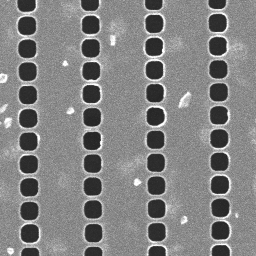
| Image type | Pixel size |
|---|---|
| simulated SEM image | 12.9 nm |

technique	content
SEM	a regular array of holes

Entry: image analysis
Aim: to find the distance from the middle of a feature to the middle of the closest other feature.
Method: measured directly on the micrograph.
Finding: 23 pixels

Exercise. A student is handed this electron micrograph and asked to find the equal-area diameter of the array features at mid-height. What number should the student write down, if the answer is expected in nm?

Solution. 250